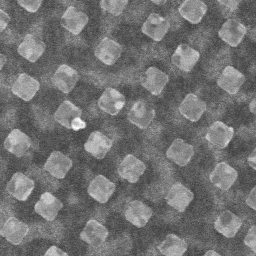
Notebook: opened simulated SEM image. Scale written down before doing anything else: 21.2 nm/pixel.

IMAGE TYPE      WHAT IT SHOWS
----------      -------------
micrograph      a regular array of raised bodies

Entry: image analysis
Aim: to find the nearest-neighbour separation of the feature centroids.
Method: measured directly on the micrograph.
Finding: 850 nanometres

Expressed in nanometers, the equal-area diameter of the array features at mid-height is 521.